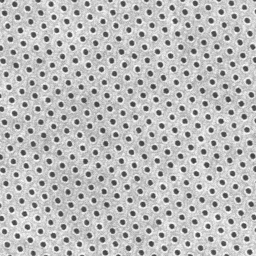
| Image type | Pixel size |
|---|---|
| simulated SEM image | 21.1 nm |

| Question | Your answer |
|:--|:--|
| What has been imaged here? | a regular array of holes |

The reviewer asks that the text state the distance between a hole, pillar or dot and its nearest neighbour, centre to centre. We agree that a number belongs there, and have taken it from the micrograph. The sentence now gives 281 nm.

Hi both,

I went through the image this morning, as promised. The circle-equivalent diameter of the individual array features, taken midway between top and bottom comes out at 133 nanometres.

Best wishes